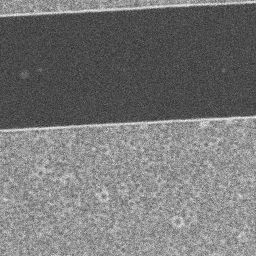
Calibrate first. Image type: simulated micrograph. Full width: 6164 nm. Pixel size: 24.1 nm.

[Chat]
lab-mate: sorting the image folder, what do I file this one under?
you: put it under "one or a few lines or trenches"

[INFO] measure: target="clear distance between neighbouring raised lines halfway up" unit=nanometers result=2740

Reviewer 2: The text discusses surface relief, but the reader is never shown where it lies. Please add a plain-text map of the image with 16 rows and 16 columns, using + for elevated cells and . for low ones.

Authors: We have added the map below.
++++++++........
................
................
................
................
................
................
.............+++
++++++++++++++++
++++++++++++++++
++++++++++++++++
++++++++++++++++
++++++++++++++++
++++++++++++++++
++++++++++++++++
++++++++++++++++